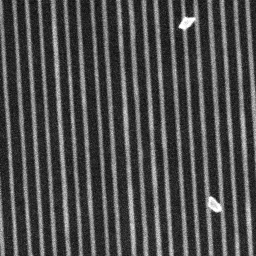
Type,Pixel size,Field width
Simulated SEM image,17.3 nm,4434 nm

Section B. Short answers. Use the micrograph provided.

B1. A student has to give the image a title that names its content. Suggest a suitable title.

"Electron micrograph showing parallel lines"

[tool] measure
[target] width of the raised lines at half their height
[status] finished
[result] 3.12 pixels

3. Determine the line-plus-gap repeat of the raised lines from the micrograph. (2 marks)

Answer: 225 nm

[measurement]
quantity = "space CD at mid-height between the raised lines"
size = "160 nm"